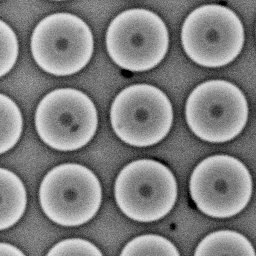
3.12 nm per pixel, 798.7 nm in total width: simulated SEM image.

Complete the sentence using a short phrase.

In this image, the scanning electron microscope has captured an array of small figures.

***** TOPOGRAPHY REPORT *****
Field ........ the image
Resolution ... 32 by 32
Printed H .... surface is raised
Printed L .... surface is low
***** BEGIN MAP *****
LLLLLLLLLLLLLLLLLLLLLLLLLLLLLLLL
LLLLLLLLLLLLLLLLHHHLLLLLHHHHHLLL
LLLLLHHHHHLLLLHHHHHHLLLHHHHHHHLL
HLLLLHHHHHHLLLHHHHHHHLLHHHHHHHLL
HHLLHHHHHHHLLHHHHHHHHLLHHHHHHHLL
HHLLHHHHHHHHLHHHHHHHHLLHHHHHHHLL
HHLLHHHHHHHLLLHHHHHHHLLHHHHHHHLL
HHLLHHHHHHHLLLHHHHHHLLLLHHHHHLLL
HLLLLHHHHHLLLLLHHHHLLLLLLLLLLLLL
LLLLLLLLLLLLLLLLLLLLLLLLLLLLLLLL
LLLLLLLLLLLLLLLLLLLLLLLLLHHHHLLL
LLLLLLLHHHLLLLLHHHHHLLLLHHHHHHLL
HLLLLHHHHHHLLLHHHHHHHLLHHHHHHHHL
HHLLLHHHHHHHLLHHHHHHHLLHHHHHHHHL
HHHLHHHHHHHHLLHHHHHHHHLHHHHHHHHL
HHHLHHHHHHHHLLHHHHHHHLLLHHHHHHHL
HHHLLHHHHHHHLLHHHHHHHLLLHHHHHHLL
HHLLLHHHHHHLLLLHHHHHLLLLLLHHLLLL
HLLLLLLHHHLLLLLLLLLLLLLLLLLLLLLL
LLLLLLLLLLLLLLLLLLLLLLLLLLLHLLLL
LLLLLLLLLLLLLLLLHHHHLLLLLHHHHHLL
HLLLLLHHHHHLLLLHHHHHHLLLHHHHHHHL
HHLLLHHHHHHHLLLHHHHHHHLLHHHHHHHL
HHHLLHHHHHHHHLHHHHHHHHLLHHHHHHHL
HHHLLHHHHHHHHLHHHHHHHHLLHHHHHHHL
HHHLLHHHHHHHLLLHHHHHHHLLHHHHHHHL
HHHLLLHHHHHHLLLHHHHHHLLLLHHHHHLL
HHLLLLLHHHHLLLLLLHHLLLLLLLLLLLLL
HLLLLLLLLLLLLLLLLLLLLLLLLLLLLLLL
LLLLLLLLLLLLLLLLLLHHLLLLLLHHHHLL
HLLLLLLHHHHLLLLLHHHHHLLLLHHHHHHL
HHHLLLHHHHHHLLLHHHHHHHLLHHHHHHHH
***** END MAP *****